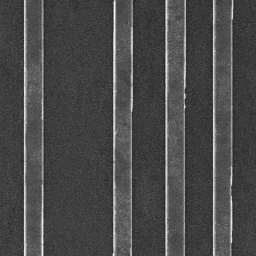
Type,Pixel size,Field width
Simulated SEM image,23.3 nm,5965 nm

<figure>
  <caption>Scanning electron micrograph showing lines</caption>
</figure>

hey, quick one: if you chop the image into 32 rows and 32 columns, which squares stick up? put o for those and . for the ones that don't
...oo.........oo.....oo....oo...
...oo.........oo.....oo....oo...
...oo.........oo.....oo....oo...
...oo.........oo.....oo....oo...
...oo.........oo.....oo....oo...
...oo.........oo.....oo....oo...
...oo.........oo.....oo....oo...
...oo.........oo.....oo....oo...
...oo.........oo.....oo....oo...
...oo.........oo.....oo....oo...
...oo.........oo.....oo....oo...
...oo.........oo.....oo....oo...
...oo.........oo.....oo....oo...
...oo.........oo.....oo....oo...
...oo.........oo.....oo....oo...
...oo.........oo.....oo....oo...
...oo.........oo.....oo....oo...
...oo.........oo.....oo....oo...
...oo.........oo.....oo....oo...
...oo.........oo.....oo....oo...
...oo.........oo.....oo....oo...
...oo.........oo.....oo....oo...
...oo.........oo.....oo....oo...
...oo.........oo.....oo....oo...
...oo.........oo.....oo....oo...
...oo.........oo.....oo....oo...
...oo.........oo.....oo....oo...
...oo.........oo.....oo....oo...
...oo.........oo.....oo....oo...
...oo.........oo.....oo....oo...
...oo.........oo.....oo....oo...
...oo.........oo.....oo....oo...